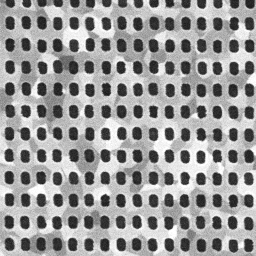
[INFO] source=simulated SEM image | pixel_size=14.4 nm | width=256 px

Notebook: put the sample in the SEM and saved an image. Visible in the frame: a regular array of holes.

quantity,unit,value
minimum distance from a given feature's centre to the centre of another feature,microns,0.226